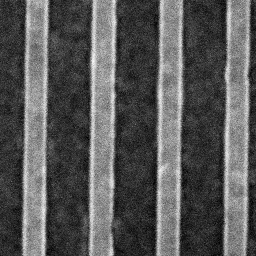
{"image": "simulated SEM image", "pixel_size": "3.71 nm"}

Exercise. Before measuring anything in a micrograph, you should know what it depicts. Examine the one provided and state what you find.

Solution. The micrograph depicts one or a few lines or trenches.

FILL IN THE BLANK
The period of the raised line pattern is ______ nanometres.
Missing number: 249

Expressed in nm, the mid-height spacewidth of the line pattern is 175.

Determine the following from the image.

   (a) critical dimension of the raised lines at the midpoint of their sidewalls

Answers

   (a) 72.8 nanometres